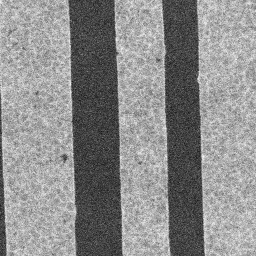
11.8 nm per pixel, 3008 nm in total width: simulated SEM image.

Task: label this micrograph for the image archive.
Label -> one or a few lines or trenches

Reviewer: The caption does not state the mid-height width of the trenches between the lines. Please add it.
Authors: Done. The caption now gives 483 nm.